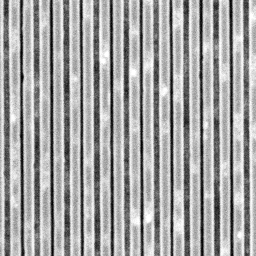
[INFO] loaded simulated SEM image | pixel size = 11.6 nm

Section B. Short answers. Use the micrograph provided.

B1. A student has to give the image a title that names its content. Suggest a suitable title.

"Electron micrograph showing parallel lines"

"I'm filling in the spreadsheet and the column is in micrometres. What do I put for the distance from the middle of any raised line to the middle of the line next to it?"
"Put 0.172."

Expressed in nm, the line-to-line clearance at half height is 73.9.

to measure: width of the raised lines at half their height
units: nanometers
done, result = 116